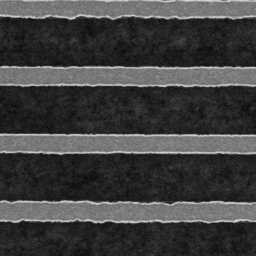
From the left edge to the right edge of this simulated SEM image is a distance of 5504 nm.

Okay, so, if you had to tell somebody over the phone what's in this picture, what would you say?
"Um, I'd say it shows one or a few lines or trenches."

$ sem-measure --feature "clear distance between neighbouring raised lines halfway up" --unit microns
1.07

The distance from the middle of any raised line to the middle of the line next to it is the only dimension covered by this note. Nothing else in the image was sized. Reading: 1.46 µm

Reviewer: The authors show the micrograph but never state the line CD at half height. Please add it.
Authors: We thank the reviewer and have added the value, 384 nm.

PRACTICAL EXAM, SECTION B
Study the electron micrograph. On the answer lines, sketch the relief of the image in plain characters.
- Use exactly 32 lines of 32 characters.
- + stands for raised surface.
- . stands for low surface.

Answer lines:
++++++++++++++++++++++++++++++++
++++++++++++++++++++++++++++++++
................................
................................
................................
................................
................................
................................
+++++++.++++++++++++..+++++.+...
++++++++++++++++++++++++++++++++
++++++++++++++++++++++++++++++++
................................
................................
................................
................................
................................
................................
++++++++++++++++++++++++++++++++
++++++++++++++++++++++++++++++++
................................
................................
................................
................................
................................
................................
+++++++++++++++++++++.++++++++++
++++++++++++++++++++++++++++++++
++++.+++++++++++++++++++++++++.+
................................
................................
................................
................................